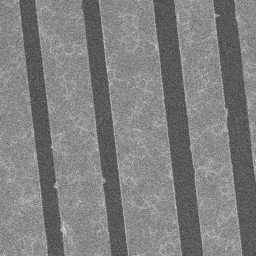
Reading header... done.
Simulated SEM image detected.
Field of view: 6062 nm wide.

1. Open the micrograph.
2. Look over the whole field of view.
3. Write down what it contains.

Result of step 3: one or a few lines or trenches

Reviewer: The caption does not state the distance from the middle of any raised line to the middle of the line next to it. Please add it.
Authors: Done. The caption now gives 1590 nm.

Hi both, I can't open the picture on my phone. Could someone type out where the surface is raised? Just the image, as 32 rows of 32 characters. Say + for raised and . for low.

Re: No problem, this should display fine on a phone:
++..++++++..+++++++...+++++..+++
++...+++++...++++++...+++++...++
+++..+++++...++++++...+++++...++
+++..++++++..++++++...+++++...++
+++..++++++..+++++++..+++++...++
+++..++++++..+++++++..+++++...++
+++..++++++..+++++++...++++...++
+++..++++++..+++++++...++++...++
+++..++++++...++++++...+++++..++
+++...+++++...++++++...+++++..++
+++...+++++...++++++...+++++...+
++++..++++++..++++++...+++++...+
++++..++++++..++++++...+++++...+
++++..++++++..+++++++...++++...+
++++..++++++..+++++++...++++...+
++++..++++++..+++++++...++++...+
++++..++++++..+++++++...++++...+
++++..++++++..+++++++...+++++..+
++++...+++++...++++++...+++++...
+++++..+++++...++++++...+++++...
+++++..++++++..++++++...+++++...
+++++..++++++..++++++...+++++...
+++++..++++++..+++++++..+++++...
+++++..++++++..+++++++...++++...
+++++..++++++..+++++++...++++...
+++++..++++++..+++++++...++++...
+++++...+++++..+++++++...+++++..
+++++...+++++...++++++...+++++..
++++++..+++++...++++++...+++++..
++++++..++++++..++++++...+++++..
++++++..++++++..++++++...+++++..
++++++..++++++..+++++++..+++++..